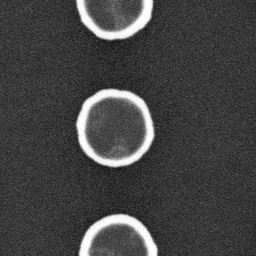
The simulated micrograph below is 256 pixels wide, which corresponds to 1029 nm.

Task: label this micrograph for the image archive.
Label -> raised bodies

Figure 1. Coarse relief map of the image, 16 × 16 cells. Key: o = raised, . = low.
.....oooo.......
......ooo.......
................
................
................
................
......ooo.......
.....oooo.......
.....oooo.......
......ooo.......
................
................
................
................
......ooo.......
.....oooo.......